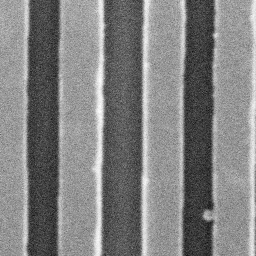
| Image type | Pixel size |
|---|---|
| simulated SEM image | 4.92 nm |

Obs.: lines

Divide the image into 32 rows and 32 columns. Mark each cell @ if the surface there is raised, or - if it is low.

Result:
@@@-----@@@@@-----@@@@@----@@@@@
@@@-----@@@@@-----@@@@@----@@@@@
@@@-----@@@@@-----@@@@@----@@@@@
@@@-----@@@@@-----@@@@@----@@@@@
@@@-----@@@@@-----@@@@@----@@@@@
@@@-----@@@@@-----@@@@@----@@@@@
@@@-----@@@@@-----@@@@@----@@@@@
@@@-----@@@@@-----@@@@@----@@@@@
@@@-----@@@@@-----@@@@@----@@@@@
@@@-----@@@@@-----@@@@@----@@@@@
@@@-----@@@@@-----@@@@@----@@@@@
@@@-----@@@@@-----@@@@@----@@@@@
@@@-----@@@@@-----@@@@@----@@@@@
@@@-----@@@@@-----@@@@@----@@@@@
@@@-----@@@@@-----@@@@@----@@@@@
@@@-----@@@@@-----@@@@@----@@@@@
@@@-----@@@@@-----@@@@@----@@@@@
@@@-----@@@@@-----@@@@@----@@@@@
@@@-----@@@@@-----@@@@@----@@@@@
@@@-----@@@@@-----@@@@@----@@@@@
@@@-----@@@@@-----@@@@@----@@@@@
@@@-----@@@@------@@@@@----@@@@@
@@@-----@@@@------@@@@@----@@@@@
@@@-----@@@@------@@@@@----@@@@@
@@@----@@@@@------@@@@@----@@@@@
@@@----@@@@@------@@@@@----@@@@@
@@@----@@@@@------@@@@@----@@@@@
@@@----@@@@@------@@@@@----@@@@@
@@@----@@@@@------@@@@@----@@@@@
@@@----@@@@@------@@@@@----@@@@@
@@@----@@@@@------@@@@@----@@@@@
@@@----@@@@@------@@@@@----@@@@@